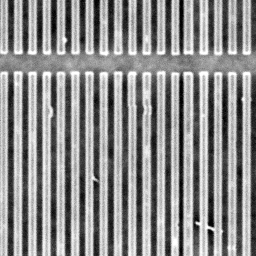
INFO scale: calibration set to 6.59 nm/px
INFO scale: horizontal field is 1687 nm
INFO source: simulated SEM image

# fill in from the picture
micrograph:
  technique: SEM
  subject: parallel lines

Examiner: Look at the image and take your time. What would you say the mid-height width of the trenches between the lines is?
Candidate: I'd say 52.7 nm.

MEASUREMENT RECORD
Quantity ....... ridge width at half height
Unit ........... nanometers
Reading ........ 39.5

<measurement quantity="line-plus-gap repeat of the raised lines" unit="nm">94.1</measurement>